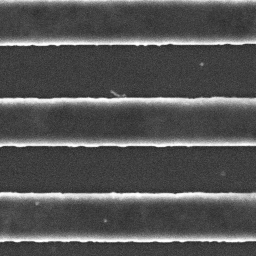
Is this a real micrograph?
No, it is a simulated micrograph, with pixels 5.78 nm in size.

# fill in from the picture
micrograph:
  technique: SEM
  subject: lines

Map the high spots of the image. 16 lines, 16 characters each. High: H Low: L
HHHHHHHHHHHHHHHH
HHHHHHHHHHHHHHHH
HHHHHHHHHHHHHHHH
LLLLLLLLLLLLLLLL
LLLLLLLLLLLLLLLL
LLLLLLLLLLLLLLLL
HHHHHHHHHHHHHHHH
HHHHHHHHHHHHHHHH
HHHHHHHHHHHHHHHH
LLLLLLLLLLLLLLLL
LLLLLLLLLLLLLLLL
LLLLLLLLLLLLLLLL
HHHHHHHHHHHHHHHH
HHHHHHHHHHHHHHHH
HHHHHHHHHHHHHHHH
LLLLLLLLLLLLLLLL